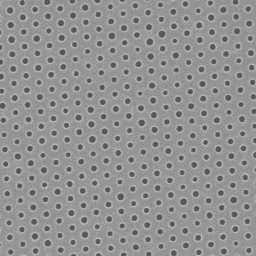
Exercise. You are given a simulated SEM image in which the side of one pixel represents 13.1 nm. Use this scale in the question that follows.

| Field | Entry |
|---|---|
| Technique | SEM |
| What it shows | a regular array of holes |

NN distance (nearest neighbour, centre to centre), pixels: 14.3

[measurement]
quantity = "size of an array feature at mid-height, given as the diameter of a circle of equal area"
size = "73.8 nm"